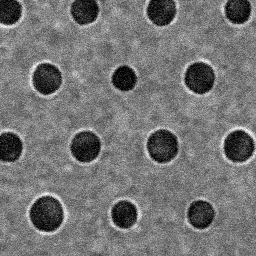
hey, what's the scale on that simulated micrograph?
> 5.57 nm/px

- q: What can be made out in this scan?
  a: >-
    a regular array of holes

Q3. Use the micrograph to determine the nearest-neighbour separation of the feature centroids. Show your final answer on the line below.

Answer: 427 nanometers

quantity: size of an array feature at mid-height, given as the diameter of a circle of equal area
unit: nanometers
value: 185